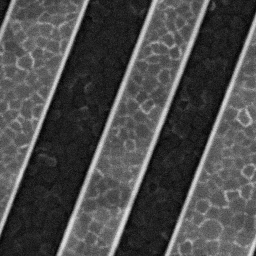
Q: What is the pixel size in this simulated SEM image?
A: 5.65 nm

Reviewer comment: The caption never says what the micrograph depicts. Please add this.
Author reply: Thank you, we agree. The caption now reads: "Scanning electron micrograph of one or a few lines or trenches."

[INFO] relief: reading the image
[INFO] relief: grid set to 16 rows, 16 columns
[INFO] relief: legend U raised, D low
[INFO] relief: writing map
DUUUUDDDDDUUUDDD
UUUUUDDDDUUUDDDD
UUUUDDDDDUUUDDDD
UUUUDDDDUUUUDDDU
UUUUDDDDUUUDDDDU
UUUDDDDDUUUDDDUU
UUUDDDDUUUDDDDUU
UUUDDDDUUUDDDDUU
UUDDDDDUUUDDDUUU
UUDDDDUUUDDDDUUU
UDDDDDUUUDDDDUUU
UDDDDUUUUDDDUUUU
UDDDDUUUDDDDUUUU
DDDDDUUUDDDUUUUU
DDDDUUUDDDDUUUUU
DDDDUUUDDDDUUUUU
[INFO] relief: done